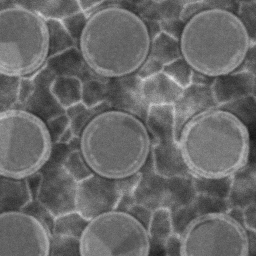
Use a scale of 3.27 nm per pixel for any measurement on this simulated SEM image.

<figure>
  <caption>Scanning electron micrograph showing raised bodies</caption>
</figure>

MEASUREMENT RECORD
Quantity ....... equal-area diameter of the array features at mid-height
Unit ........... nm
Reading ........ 219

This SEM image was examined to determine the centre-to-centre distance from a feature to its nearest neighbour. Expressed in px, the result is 99.9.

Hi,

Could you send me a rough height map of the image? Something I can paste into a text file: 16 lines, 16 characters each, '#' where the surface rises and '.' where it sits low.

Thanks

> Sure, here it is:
................
###..####...###.
###..####..####.
###..####...###.
##....##.....#..
................
................
##....##....###.
###..####..#####
###..####..#####
##....###...###.
................
................
##....##.....#..
###..####..####.
###..####..####.